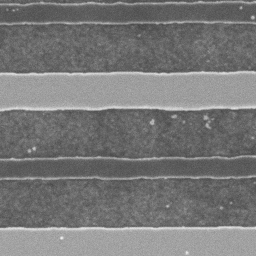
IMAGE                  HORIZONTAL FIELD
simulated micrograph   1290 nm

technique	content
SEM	lines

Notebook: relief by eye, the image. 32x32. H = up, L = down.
LLLLHHHLLLHHHLHHHHHHHHHHHHHHHHHH
HHHHHHHHHHHHHHHHHHHHHHHHHHHHHHHH
HHHHHHHHHHHHHHHHHHHHHHHHHHHHHHHH
LLLLLLLLLLLLLLLLLLLLLLLLLLLLLLLL
LLLLLLLLLLLLLLLLLLLLLLLLLLLLLLLL
LLLLLLLLLLLLLLLLLLLLLLLLLLLLLLLL
LLLLLLLLLLLLLLLLLLLLLLLLLLLLLLLL
LLLLLLLLLLLLLLLLLLLLLLLLLLLLLLLL
LLLLLLLLLLLLLLLLLLLLLLLLLLLLLLLL
HHHHHHHHHHHHHHHHHHHHHHHHHHHHHHHH
HHHHHHHHHHHHHHHHHHHHHHHHHHHHHHHH
HHHHHHHHHHHHHHHHHHHHHHHHHHHHHHHH
HHHHHHHHHHHHHHHHHHHHHHHHHHHHHHHH
HHHHHHHHHHHHHHHHHHHHHHHHHHHHHHHH
LLLLLLLLLLLLLLLLLLLLLLLLLLLLLLLL
LLLLLLLLLLLLLLLLLLLLLLLLLLLLLLLL
LLLLLLLLLLLLLLLLLLLLLLLLLLLLLLLL
LLLLLLLLLLLLLLLLLLLLLLLLLLLLLLLL
LLLLLLLLLLLLLLLLLLLLLLLLLLLLLLLL
LLLLLLLLLLLLLLLLLLLLLLLLLLLLLLLL
HHHHHHHHHHHHHHHHHHHHHHHHHHHHHHHH
HHHHHHHHHHHHHHHHHHHHHHHHHHHHHHHH
LLLLLLLLLLLLLLLLLLLLLLLLLLLLLLLL
LLLLLLLLLLLLLLLLLLLLLLLLLLLLLLLL
LLLLLLLLLLLLLLLLLLLLLLLLLLLLLLLL
LLLLLLLLLLLLLLLLLLLLLLLLLLLLLLLL
LLLLLLLLLLLLLLLLLLLLLLLLLLLLLLLL
LLLLLLLLLLLLLLLLLLLLLLLLLLLLLLLL
LHHLLLHHHLHHHHLHHHHHHHHHHHHHHHHH
HHHHHHHHHHHHHHHHHHHHHHHHHHHHHHHH
HHHHHHHHHHHHHHHHHHHHHHHHHHHHHHHH
HHHHHHHHHHHHHHHHHHHHHHHHHHHHHHHH